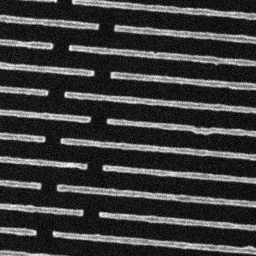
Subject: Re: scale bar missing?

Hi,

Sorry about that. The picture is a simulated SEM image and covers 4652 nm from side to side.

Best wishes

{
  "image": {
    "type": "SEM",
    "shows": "parallel lines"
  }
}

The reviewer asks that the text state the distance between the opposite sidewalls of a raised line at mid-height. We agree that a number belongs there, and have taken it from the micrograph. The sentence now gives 92.8 nm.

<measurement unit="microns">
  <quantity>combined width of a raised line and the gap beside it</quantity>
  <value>0.425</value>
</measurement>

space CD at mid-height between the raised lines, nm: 328